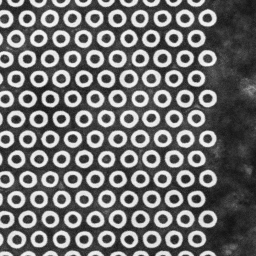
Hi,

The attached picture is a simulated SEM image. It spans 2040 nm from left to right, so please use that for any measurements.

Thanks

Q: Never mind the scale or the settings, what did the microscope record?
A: a regular array of ring-shaped raised bodies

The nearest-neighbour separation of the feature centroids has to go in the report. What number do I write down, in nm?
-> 178